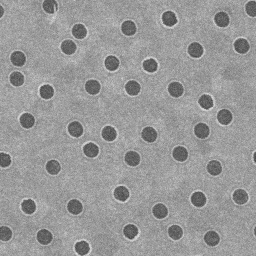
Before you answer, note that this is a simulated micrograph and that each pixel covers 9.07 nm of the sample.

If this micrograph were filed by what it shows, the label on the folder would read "a regular array of holes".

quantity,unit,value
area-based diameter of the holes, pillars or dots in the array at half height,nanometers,148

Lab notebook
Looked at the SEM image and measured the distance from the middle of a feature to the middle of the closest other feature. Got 285 nanometers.